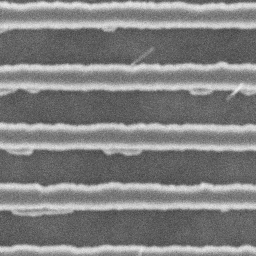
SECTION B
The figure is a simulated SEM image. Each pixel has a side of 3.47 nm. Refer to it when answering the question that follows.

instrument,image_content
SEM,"lines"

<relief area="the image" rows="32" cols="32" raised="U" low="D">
UDDDDUUUDUDDDDUUUUDDDDDDDDDDDDDD
UUUUUUUUUUUUUUUUUUUUUUUUUUUUUUUU
UUUUUUUUUUUUUUUUUUUUUUUUUUUUUUUU
DDDDDDDDDDDDDDDDDDDDDDDDDDDDDDDD
DDDDDDDDDDDDDDDDDDDDDDDDDDDDDDDD
DDDDDDDDDDDDDDDDDDDDDDDDDDDDDDDD
DDDDDDDDDDDDDDDDDDDDDDDDDDDDDDDD
DDDDDDDDDDDDDDDDDDDDDDDDDDDDDDDD
UUUUUUUUUUUUUUUUUUUUUUUUUUUUUUUU
UUUUUUUUUUUUUUUUUUUUUUUUUUUUUUUU
UUUUUUUUUUUUUUUUUUUUUUUUUUUUUUUU
DDDDDDDDDDDDDDDDDDDDDDDDDDDDDDDD
DDDDDDDDDDDDDDDDDDDDDDDDDDDDDDDD
DDDDDDDDDDDDDDDDDDDDDDDDDDDDDDDD
DDDDDDDDDDDDDDDDDDDDDDDDDDDDDDDD
DDDDDDDDDDDDDDDDDDDDDDDDDDDDDDDD
UUUUUUUUUUUUUUUUUUUUUUUUUUUUUUUU
UUUUUUUUUUUUUUUUUUUUUUUUUUUUUUUU
DUUUUUUUUUDUUUUUUUUUUUUUUUUUUUUU
DDDDDDDDDDDDDDDDDDDDDDDDDDDDDDDD
DDDDDDDDDDDDDDDDDDDDDDDDDDDDDDDD
DDDDDDDDDDDDDDDDDDDDDDDDDDDDDDDD
DDDDDDDDDDDDDDDDDDDDDDDDDDDDDDDD
UUUUUUUUUUUUUUUUUUUUUUUUUUUUUUUU
UUUUUUUUUUUUUUUUUUUUUUUUUUUUUUUU
UUUUUUUUUUUUUUUUUUUUUUUUUUUUUUUU
DDDDDDDDDDDDDDDDDDDDDDDDDDDDDDDD
DDDDDDDDDDDDDDDDDDDDDDDDDDDDDDDD
DDDDDDDDDDDDDDDDDDDDDDDDDDDDDDDD
DDDDDDDDDDDDDDDDDDDDDDDDDDDDDDDD
DDDDDDDDDDDDDDDDDDDDDDDDDDDDDDDD
UUUUUUUUUUUUUUUUUUUUUUUUUUUUUUUU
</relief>